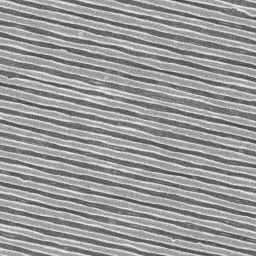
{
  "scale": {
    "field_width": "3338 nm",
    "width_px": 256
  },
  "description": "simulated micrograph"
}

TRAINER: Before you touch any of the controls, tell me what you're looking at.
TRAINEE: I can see parallel lines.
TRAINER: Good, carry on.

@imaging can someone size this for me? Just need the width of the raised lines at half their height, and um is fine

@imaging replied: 0.0938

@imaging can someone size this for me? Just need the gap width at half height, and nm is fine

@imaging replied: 71.5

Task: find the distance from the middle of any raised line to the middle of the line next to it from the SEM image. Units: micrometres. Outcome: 0.158